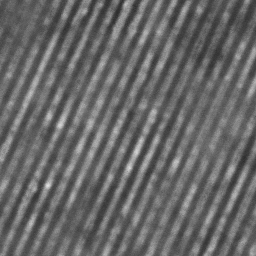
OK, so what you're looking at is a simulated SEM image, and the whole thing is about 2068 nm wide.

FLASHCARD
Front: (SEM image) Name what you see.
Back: parallel lines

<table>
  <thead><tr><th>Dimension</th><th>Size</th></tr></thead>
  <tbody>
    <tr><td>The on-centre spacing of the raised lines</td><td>108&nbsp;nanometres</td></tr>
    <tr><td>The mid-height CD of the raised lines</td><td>38.8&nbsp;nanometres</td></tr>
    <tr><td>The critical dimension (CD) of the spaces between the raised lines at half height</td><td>69.2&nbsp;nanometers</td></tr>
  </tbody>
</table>